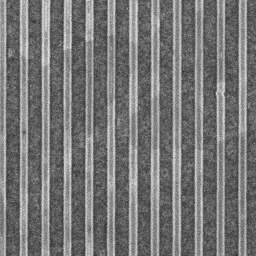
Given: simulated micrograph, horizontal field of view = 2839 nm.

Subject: parallel lines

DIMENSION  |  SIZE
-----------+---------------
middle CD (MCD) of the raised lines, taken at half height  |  70.7 nm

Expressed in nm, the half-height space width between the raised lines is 170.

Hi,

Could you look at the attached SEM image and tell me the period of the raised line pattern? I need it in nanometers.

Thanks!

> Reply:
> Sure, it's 242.